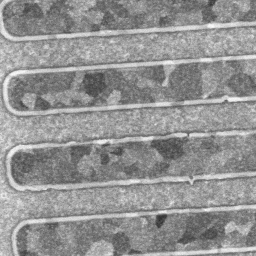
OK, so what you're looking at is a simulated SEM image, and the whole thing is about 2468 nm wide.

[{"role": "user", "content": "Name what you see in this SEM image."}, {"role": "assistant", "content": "one or a few lines or trenches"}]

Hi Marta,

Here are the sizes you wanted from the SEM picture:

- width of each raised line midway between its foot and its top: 0.396 microns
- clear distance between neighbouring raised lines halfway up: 0.327 micrometres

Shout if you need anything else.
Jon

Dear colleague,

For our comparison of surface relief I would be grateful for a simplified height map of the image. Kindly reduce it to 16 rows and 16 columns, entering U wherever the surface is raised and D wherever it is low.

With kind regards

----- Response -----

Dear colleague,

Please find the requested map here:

UUUUUUUUUUUUUUUU
UUUUUUUUUUUUUUUD
DDDDDDDDDDDDDDDD
DDDDDDDDDDDDDDDD
DDUUUUUUUUUUUUUU
UUUUUUUUUUUUUUUU
DUUUUUUUUUDDDDDD
DDDDDDDDDDDDDDDD
DDDDDDDDDDDUUUUU
DUUUUUUUUUUUUUUU
DUUUUUUUUUUUUUUU
DUUUUUDDDDDDDDDD
DDDDDDDDDDDDDDDD
DDDDDDDUUUUUUUUU
DUUUUUUUUUUUUUUU
DUUUUUUUUUUUUUUU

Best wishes